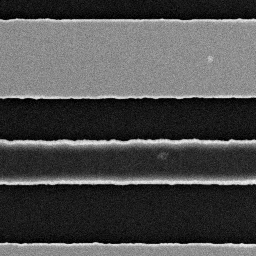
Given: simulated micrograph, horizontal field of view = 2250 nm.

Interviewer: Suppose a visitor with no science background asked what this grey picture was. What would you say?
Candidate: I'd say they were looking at lines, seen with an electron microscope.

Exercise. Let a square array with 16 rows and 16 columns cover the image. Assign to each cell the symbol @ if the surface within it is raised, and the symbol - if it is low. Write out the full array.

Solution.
----------------
@@@@@@@@@@@@@@@@
@@@@@@@@@@@@@@@@
@@@@@@@@@@@@@@@@
@@@@@@@@@@@@@@@@
@@@@@@@@@@@@@@@@
----------------
----------------
----------------
@@@@@@@@@@@@@@@@
@@@@@@@@@@@@@@@@
----------------
----------------
----------------
----------------
@@@@@@@@@@@@@@@@